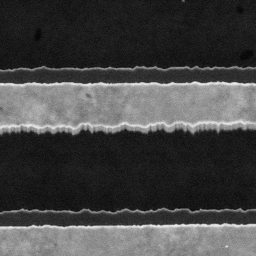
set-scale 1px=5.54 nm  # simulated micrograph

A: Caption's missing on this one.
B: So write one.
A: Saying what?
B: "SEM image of lines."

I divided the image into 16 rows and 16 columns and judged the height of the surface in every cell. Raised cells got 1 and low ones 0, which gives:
0000000000000000
0000000000000000
0000000000000000
0000000000000000
1111111111111111
1111111111111111
1111111111111111
1111111111111111
0000000000000000
0000000000000000
0000000000000000
0000000000000000
0000000000000000
1111111111111111
1111111111111111
1111111111111111